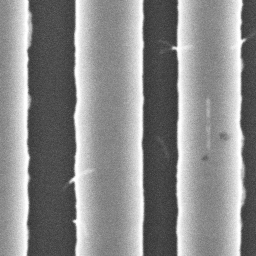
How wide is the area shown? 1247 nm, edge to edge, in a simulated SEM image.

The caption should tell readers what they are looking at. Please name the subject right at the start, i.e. lines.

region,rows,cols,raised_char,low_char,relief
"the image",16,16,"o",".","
oo...oooo..oooo.
oo...oooo..oooo.
oo...oooo..oooo.
oo...oooo..oooo.
oo...oooo..oooo.
oo...oooo..oooo.
oo...oooo..oooo.
oo...oooo..oooo.
oo...oooo..oooo.
oo...oooo..oooo.
oo...oooo..oooo.
oo...oooo..oooo.
oo...oooo..oooo.
oo...oooo..oooo.
oo...oooo..oooo.
oo...oooo..oooo.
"